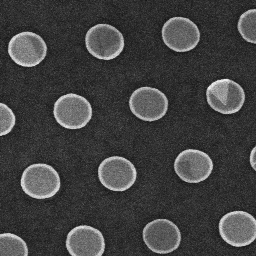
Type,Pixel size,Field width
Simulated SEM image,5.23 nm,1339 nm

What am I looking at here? a regular array of raised bodies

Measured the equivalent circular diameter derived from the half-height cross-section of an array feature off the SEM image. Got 182 nm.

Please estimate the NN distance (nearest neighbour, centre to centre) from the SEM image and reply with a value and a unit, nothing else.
399 nm